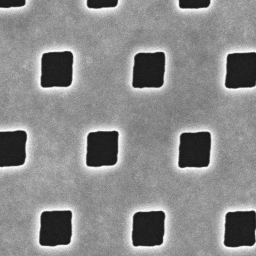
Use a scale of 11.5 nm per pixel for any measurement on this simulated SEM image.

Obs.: holes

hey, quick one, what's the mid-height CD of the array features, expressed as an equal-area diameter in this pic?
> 432 nm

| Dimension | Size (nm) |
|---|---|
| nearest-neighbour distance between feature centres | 1050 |